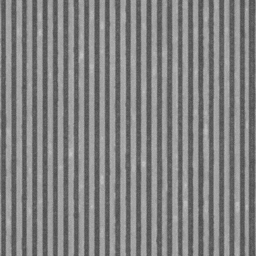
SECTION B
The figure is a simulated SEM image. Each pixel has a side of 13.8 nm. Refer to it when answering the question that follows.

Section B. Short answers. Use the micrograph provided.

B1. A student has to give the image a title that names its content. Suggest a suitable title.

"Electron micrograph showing parallel lines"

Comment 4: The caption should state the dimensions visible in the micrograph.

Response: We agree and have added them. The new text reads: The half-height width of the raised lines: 70.7 nanometres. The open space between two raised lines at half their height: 79.3 nm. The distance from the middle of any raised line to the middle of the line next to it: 143 nm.